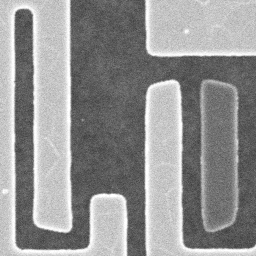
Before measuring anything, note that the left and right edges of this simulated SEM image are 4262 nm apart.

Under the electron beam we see wiring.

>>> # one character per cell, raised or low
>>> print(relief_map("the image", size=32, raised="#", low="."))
########...........#############
##..####...........#############
#...####...........#############
#...####...........#############
#...####...........#############
#...####...........#############
#...####...........#############
#...####........................
#...####........................
#...####........................
##..#####...........##....##....
##..#####..........###...####...
##..####...........###...####...
##..####...........###...####...
##..####...........###...####...
##..#####.........####...####...
##...####.........####...####...
##...####.........#####..####...
##...####.........#####..####...
##...####.........#####..####...
##...####.........#####..####...
##...####..........####..####...
##...####..........####..####...
##...####..........####..####...
##...####..........####..####...
##..#####...####...####..####...
##..#####...####...####..####...
##..#####...####...####...###...
##....##....####...####...#.....
##..........####...####.........
##.........#####...####.........
###.....########...#############